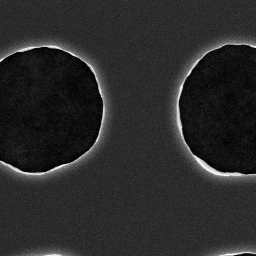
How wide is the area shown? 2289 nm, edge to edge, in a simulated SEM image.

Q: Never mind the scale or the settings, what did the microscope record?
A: holes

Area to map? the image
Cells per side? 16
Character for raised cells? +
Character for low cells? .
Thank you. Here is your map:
++++++++++++++++
++++++++++++++++
++++++++++++++++
+....++++++++...
......++++++....
......+++++.....
......+++++.....
......+++++.....
......+++++.....
.....+++++++....
+..++++++++++...
++++++++++++++++
++++++++++++++++
++++++++++++++++
++++++++++++++++
++++++++++++++++